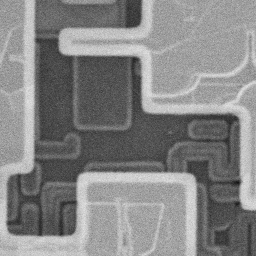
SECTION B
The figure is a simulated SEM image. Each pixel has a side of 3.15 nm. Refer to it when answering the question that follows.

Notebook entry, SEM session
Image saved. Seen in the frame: wiring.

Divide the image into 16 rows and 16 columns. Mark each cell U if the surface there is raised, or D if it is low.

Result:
UUDDDDDDDUUUUUUU
UUDDDDDDDUUUUUUU
UUDDUUUUUUUUUUUU
UUDDDDDDDUUUUUUU
UUDDDDDDDUUUUUUU
UUDDDDDDDUUUUUUU
UUDDDDDDDDUUUUUU
UUDDDDDDDDDDDDDU
UUDDDDDDDDDDDDDU
UUDDDDDDDDDDDDDU
UUDDDDDDDDDDDDDU
DDDDDUUUUUUUDDDU
DDDDDUUUUUUUDDDU
DDDDDUUUUUUUDDDD
DDDDDUUUUUUUDDDD
UUUUUUUUUUUUDDDD